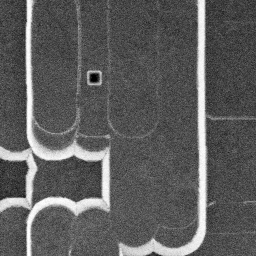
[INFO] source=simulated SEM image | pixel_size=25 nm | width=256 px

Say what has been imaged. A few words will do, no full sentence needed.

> wiring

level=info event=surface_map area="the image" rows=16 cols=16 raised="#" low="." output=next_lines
..###########...
..###########...
..###########...
..###########...
..###########...
..###########...
..###########...
..###########...
..###########...
...#.########...
.......######...
.......######...
......#######...
..###########...
..###########...
..##########....